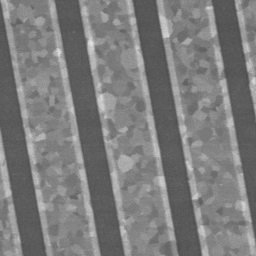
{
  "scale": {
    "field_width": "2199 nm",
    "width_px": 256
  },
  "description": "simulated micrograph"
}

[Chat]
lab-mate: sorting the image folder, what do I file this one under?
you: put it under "one or a few lines or trenches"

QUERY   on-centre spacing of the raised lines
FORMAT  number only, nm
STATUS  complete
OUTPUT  661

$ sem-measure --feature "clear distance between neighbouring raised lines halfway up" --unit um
0.246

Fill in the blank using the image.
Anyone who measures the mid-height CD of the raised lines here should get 0.403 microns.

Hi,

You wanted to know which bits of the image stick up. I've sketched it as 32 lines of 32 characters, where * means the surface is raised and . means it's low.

.*****....******....******....**
.******....*****....******....**
.******....******...******....**
.******....******...*******...**
.******....******....******...**
.******....******....******....*
..******...******....******....*
..******....******...******....*
..******....******...*******...*
..******....******....******...*
..******....******....******....
...*****....******....******....
...******....*****....******....
...******....******...******....
...******....******...*******...
...******....******....******...
...******....******....******...
....******...******....******...
....******....******...******...
....******....******...*******..
....******....******....******..
*...******....******....******..
*...******....******....******..
*....******....*****....******..
*....******....******...******..
*....******....******...*******.
*....******....******....******.
**...******....******....******.
**....******...******....******.
**....******...*******...******.
**....******....******...*******
**....******....******....******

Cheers